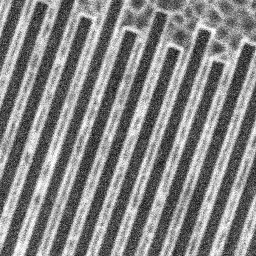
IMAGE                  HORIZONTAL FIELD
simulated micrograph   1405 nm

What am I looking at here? parallel lines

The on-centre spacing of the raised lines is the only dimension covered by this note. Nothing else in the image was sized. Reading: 128 nanometres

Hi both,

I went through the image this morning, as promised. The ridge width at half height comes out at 0.0514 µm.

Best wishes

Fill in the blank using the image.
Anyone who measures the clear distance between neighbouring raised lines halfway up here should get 77.3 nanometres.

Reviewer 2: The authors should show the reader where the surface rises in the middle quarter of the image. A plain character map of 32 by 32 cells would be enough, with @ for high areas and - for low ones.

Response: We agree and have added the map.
----@@----@@----@@----@@----@@--
---@@----@@@---@@@----@@----@@--
---@@----@@----@@@---@@@---@@@--
---@@----@@----@@----@@----@@---
--@@----@@@---@@@----@@----@@---
--@@----@@----@@@---@@@---@@@---
--@@----@@----@@----@@----@@----
-@@----@@@---@@@----@@----@@----
-@@----@@----@@@---@@@---@@@---@
-@@----@@----@@----@@----@@----@
@@----@@@---@@@----@@----@@----@
@@----@@----@@@---@@----@@@---@@
@@----@@----@@----@@----@@----@@
@----@@@---@@@----@@----@@----@@
@----@@----@@----@@----@@@---@@@
@----@@----@@----@@----@@----@@@
----@@@---@@@---@@@----@@----@@-
----@@----@@----@@----@@@---@@@-
---@@@----@@----@@----@@----@@@-
---@@@---@@@----@@---@@@----@@--
---@@----@@----@@----@@@---@@@--
---@@----@@----@@----@@----@@---
--@@@---@@@---@@@---@@@----@@---
--@@----@@----@@----@@@---@@@---
--@@----@@----@@----@@----@@----
-@@@---@@@---@@@---@@@----@@----
-@@----@@----@@----@@@---@@@----
-@@----@@----@@----@@----@@----@
@@----@@@---@@@---@@@----@@----@
@@----@@----@@----@@@---@@@---@@
@@----@@----@@----@@----@@----@@
@----@@@---@@@---@@@----@@----@@